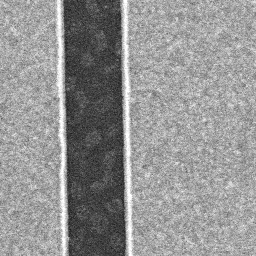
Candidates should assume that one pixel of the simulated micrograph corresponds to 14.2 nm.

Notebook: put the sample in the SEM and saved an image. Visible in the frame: one or a few lines or trenches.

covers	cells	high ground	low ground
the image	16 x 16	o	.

oooo....oooooooo
oooo....oooooooo
oooo....oooooooo
oooo....oooooooo
oooo....oooooooo
oooo....oooooooo
oooo....oooooooo
oooo....oooooooo
oooo....oooooooo
oooo....oooooooo
oooo....oooooooo
oooo....oooooooo
oooo....oooooooo
oooo....oooooooo
oooo....oooooooo
oooo....oooooooo